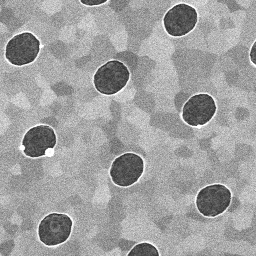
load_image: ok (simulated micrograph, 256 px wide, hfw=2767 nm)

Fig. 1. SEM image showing a regular array of holes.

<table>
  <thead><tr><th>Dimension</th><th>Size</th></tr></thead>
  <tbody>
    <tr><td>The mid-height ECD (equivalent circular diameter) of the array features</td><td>362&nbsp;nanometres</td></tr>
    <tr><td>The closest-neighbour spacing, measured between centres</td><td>0.981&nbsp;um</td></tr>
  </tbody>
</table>